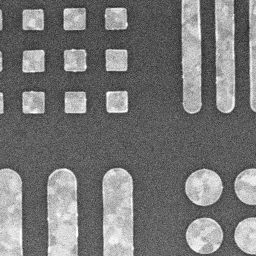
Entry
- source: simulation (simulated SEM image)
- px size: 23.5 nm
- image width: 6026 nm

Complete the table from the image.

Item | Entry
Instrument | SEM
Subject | groups of lines, slits or small figures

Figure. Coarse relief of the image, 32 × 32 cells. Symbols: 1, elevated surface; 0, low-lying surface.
00000000000000000000000110011001
00011000111001110000000110011001
00011000111001110000000110011001
00011000110000110000000110011001
00000000000000000000000110011001
00000000000000000000000110011001
00011000110001110000000110011001
00011000111001110000000110011001
00011000111001110000000110011001
00000000000000000000000110011001
00000000000000000000000110011000
00000000000000000000000110011000
00011000111001110000000110011000
00011000111001110000000110011000
00000000000000000000000000000000
00000000000000000000000000000000
00000000000000000000000000000000
00000000000000000000000000000000
00000000000000000000000000000000
00000000000000000000000000000000
00000000000000000000000000000000
11000001100000110000000011100011
11100011100001110000000111110011
11100011100001110000000111110111
11100011100001110000000011100011
11100011110001110000000001000000
11100011110001111000000000000000
11100011110001111000000001000001
11100011110001111000000011100011
11100011110001111000000111110111
11100011110001111000000011110011
11100011110001111000000001000001